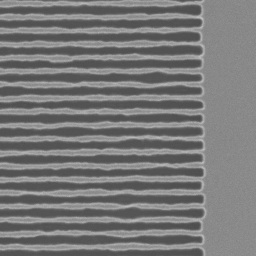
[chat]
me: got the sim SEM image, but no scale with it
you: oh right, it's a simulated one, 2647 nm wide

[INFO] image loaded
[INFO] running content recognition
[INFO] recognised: parallel lines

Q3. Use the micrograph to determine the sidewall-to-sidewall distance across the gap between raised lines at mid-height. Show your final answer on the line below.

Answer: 77.5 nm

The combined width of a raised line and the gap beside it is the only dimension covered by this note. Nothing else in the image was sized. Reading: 140 nm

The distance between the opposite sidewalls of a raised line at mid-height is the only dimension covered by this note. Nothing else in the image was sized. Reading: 58.1 nm